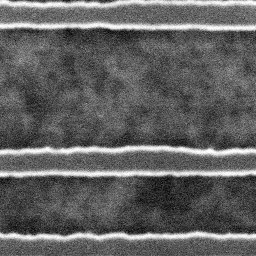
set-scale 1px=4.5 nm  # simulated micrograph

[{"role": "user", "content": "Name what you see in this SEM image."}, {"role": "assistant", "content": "lines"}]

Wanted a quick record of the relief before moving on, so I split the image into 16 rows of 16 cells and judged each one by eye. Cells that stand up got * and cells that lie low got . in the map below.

****************
****************
................
................
................
................
................
................
................
****************
****************
................
................
................
................
****************